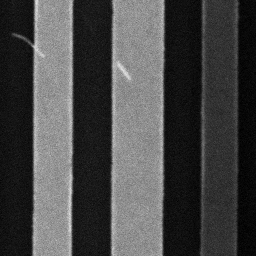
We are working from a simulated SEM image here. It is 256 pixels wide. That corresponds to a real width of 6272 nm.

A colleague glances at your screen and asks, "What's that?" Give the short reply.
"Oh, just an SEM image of lines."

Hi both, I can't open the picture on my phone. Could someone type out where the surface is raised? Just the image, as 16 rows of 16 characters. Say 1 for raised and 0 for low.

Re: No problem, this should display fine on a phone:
0011000111000110
0011000111000110
0011000111000110
0011000111000110
0011000111000110
0011000111000110
0011000111000110
0011000111000110
0011000111000110
0011000111000110
0011000111000110
0011000111000110
0011000111000110
0011000111000110
0011000111000110
0011000111000110